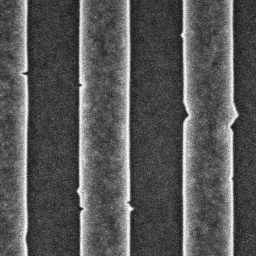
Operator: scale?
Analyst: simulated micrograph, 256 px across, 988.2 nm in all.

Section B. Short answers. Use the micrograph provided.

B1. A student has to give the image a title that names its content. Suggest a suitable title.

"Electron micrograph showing one or a few lines or trenches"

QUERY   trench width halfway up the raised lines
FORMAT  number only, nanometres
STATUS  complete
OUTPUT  211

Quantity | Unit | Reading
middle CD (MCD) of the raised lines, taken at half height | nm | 186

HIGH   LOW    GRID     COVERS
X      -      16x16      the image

XX---XXX---XXX--
XX---XXX---XXX--
XX---XXX---XXX--
XX---XXX----XX--
XX---XXX----XXX-
XX---XXX----XXX-
XX---XXX----XXX-
XX---XXX----XXX-
XX---XXX----XX--
XX---XXX----XX--
XX---XXX----XX--
XX---XXX----XX--
XX---XXX----XX--
XX---XXX----XX--
XX---XXX----XX--
XX---XXX----XX--